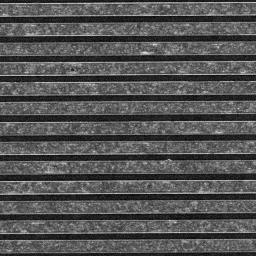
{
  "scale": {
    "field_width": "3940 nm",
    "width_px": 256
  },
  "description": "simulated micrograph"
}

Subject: parallel lines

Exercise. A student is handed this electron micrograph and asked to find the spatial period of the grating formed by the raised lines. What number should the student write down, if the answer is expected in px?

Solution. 19.7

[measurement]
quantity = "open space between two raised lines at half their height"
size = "0.104 micrometres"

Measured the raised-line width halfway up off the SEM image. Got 196 nanometres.